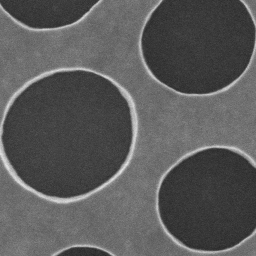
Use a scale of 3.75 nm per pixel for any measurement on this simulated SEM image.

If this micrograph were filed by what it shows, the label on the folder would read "holes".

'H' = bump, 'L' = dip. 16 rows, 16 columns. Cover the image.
LLLLLLHHHHLLLLLH
HLLLHHHHHLLLLLLL
HHHHHHHHHLLLLLLL
HHHHHHHHHLLLLLLL
HHHLLLHHHLLLLLLH
HHLLLLLHHHHLLLHH
HLLLLLLLHHHHHHHH
LLLLLLLLHHHHHHHH
LLLLLLLLHHHHHHHH
LLLLLLLLHHHHLLLH
HLLLLLLLHHHLLLLL
HHLLLLLHHHLLLLLL
HHHHHHHHHHLLLLLL
HHHHHHHHHHLLLLLL
HHHHHHHHHHHLLLLL
HHHHLLHHHHHHLLHH